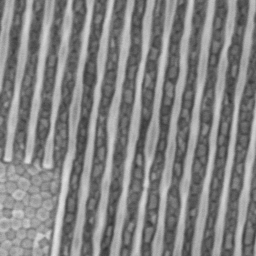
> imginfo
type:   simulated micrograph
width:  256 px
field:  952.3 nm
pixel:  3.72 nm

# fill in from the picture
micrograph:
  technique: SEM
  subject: parallel lines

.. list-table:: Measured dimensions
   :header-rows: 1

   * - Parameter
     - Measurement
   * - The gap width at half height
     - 50.2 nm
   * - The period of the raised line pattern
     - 20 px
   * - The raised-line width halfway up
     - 23.4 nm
